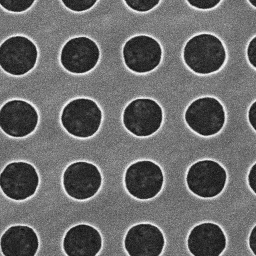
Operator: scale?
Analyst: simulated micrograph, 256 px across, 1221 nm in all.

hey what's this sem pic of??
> a regular array of holes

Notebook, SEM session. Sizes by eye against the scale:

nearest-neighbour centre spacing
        298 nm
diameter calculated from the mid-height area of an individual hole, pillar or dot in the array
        0.186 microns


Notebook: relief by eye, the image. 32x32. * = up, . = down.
....****....****....****...****.
**.*****************************
********************************
********************************
*****************.******...*****
....****....****....***.....***.
.....***....***.....***.....***.
.....***....***.....***.....***.
....****....****...*****....****
********************************
********************************
********************************
*********..******..*****...*****
....****....****....***.....***.
.....***.....**.....***.....***.
.....***.....**.....***.....***.
*...*****...****...*****...*****
********************************
********************************
********************************
*...*****..******..*****...*****
.....***....****....***.....***.
.....***.....***....***.....***.
.....***....****....****....***.
*...*****...*****..******..*****
********************************
********************************
********************************
*...*****...****....****....****
.....***.....***....****....***.
.....***.....***....***.....***.
.....***....****....****....****